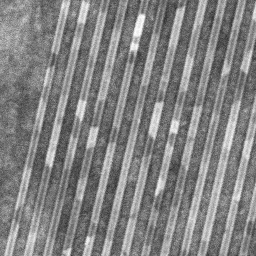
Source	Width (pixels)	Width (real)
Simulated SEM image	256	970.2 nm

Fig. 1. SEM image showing parallel lines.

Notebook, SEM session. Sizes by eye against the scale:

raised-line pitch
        72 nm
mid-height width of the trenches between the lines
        49.9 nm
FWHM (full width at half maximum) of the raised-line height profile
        23.6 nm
